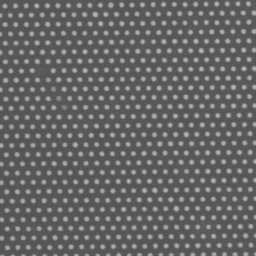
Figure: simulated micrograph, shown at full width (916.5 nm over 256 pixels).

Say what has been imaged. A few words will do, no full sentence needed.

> a regular array of raised bodies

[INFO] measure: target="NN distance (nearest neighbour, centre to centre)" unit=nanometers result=36.7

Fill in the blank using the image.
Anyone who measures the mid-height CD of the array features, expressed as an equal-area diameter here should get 16.1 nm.